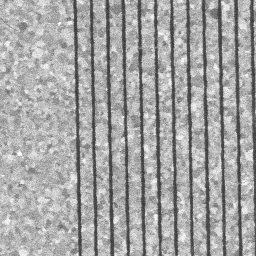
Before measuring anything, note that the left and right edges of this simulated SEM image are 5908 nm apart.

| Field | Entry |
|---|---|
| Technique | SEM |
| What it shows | parallel lines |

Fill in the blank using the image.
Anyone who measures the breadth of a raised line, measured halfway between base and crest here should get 286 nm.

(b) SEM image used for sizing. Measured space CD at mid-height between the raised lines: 89.4 nanometres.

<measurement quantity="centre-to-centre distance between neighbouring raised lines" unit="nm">370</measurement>